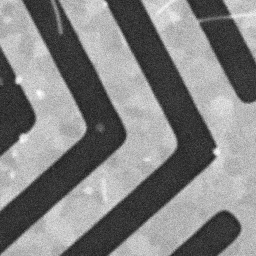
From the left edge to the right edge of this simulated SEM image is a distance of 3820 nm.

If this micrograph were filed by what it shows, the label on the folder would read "groups of lines, slits or small figures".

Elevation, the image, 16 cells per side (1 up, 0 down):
1100111001110011
1100111000110001
1110011100111001
1110001100011000
0111001110011100
0111000110001110
0011100111001111
0011100011000111
0111100011100111
1111000111100111
1110001111000111
1100011110001111
1000111100011111
0001110000111001
0011100011110001
0111000111100011